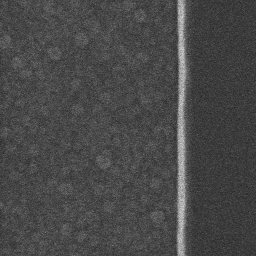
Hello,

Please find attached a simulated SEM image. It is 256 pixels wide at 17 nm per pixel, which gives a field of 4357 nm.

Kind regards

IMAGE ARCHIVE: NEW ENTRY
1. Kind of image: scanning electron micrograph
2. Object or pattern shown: one or a few lines or trenches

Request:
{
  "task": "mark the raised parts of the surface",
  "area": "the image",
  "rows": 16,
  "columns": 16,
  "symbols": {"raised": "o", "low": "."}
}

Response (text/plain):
...........ooooo
...........ooooo
...........ooooo
...........ooooo
...........ooooo
...........ooooo
...........ooooo
...........ooooo
...........ooooo
...........ooooo
...........ooooo
...........ooooo
...........ooooo
...........ooooo
...........ooooo
...........ooooo